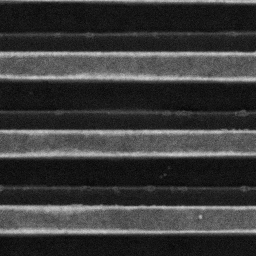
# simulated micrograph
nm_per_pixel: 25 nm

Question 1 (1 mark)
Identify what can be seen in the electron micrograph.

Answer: lines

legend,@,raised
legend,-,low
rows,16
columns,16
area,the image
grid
----------------
----------------
----------------
@@@@@@@@@@@@@@@@
@@@@@@@@@@@@@@@@
----------------
----------------
----------------
@@@@@@@@@@@@@@@@
@@@@@@@@@@@@@@@@
----------------
----------------
----------------
@@@@@@@@@@@@@@@@
@@@@@@@@@@@@@@@@
----------------